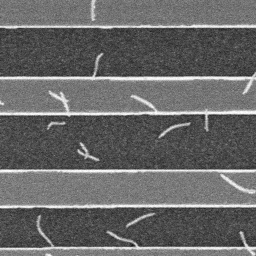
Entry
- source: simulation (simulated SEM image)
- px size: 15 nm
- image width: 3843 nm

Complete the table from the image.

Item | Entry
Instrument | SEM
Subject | lines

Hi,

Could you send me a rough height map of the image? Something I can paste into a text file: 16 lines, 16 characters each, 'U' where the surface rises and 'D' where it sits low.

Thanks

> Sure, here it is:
UUUUUUUUUUUUUUUU
UUUUUUUUUUUUUUUU
DDDDDDDDDDDDDDDD
DDDDDDDDDDDDDDDD
DDDDDDDDDDDDDDDD
UUUUUUUUUUUUUUUU
UUUUUUUUUUUUUUUU
DDDDDDDDDDDDDDDD
DDDDDDDDDDDDDDDD
DDDDDDDDDDDDDDDD
DDDDDDDDDDDDDDDD
UUUUUUUUUUUUUUUU
UUUUUUUUUUUUUUUU
DDDDDDDDDDDDDDDD
DDDDDDDDDDDDDDDD
DDDDDDDDUDDDDDUU